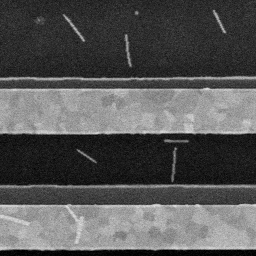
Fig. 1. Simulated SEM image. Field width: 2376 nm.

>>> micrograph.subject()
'lines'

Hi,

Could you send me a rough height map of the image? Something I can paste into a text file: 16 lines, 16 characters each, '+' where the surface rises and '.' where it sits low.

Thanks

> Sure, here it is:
................
................
................
................
................
++++++++++++++++
++++++++++++++++
++++++++++++++++
................
................
................
................
++++++++++++++++
++++++++++++++++
++++++++++++++++
++++++++++++++++